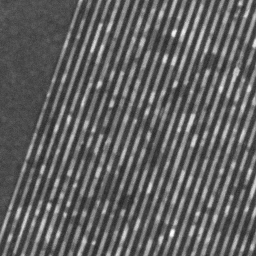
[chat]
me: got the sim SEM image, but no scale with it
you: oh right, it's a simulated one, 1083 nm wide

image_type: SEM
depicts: parallel lines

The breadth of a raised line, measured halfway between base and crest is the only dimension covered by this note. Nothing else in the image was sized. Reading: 13 nanometers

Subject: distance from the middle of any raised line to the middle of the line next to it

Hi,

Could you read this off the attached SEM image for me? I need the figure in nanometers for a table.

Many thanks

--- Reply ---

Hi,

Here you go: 37.9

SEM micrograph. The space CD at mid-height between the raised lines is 25.6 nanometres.